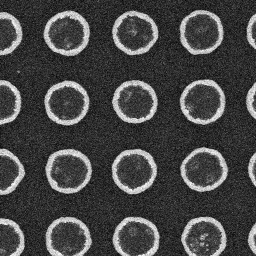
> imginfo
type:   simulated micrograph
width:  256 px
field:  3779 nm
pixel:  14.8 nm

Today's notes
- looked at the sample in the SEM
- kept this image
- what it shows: a regular array of raised bodies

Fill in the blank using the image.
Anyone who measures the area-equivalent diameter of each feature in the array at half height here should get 600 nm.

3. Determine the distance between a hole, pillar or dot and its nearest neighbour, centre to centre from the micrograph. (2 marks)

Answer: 997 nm